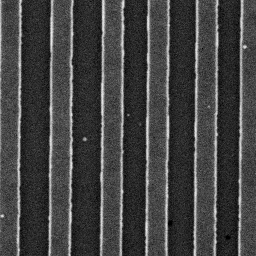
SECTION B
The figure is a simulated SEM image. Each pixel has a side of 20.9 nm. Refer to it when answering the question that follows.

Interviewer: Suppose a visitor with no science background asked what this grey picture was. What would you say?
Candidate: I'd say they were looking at lines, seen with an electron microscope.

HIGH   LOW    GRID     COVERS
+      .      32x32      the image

+++....++....++....++....++...++
+++...+++....++....++....++...++
+++...+++....++....++....++...++
+++...+++....++....++....++...++
+++...+++....++....++....++...++
+++...+++....++....++....++...++
+++...+++....++....++....++...++
++....+++....++....++....++...++
+++...+++....++....++....++...++
+++...+++....++....++....++...++
++....+++....++....++....++...++
++....+++....++....++....++...++
++....+++....++....++....++...++
++....+++....++....++....++...++
++....+++....++...+++....++...++
++....+++....++...+++...+++...++
++....+++....++...+++...+++...++
++....+++....++...+++...+++...++
++....+++....++...+++...+++...++
++....+++....++...+++...+++...++
++....+++....++...+++...+++...++
++....+++....++...+++...+++...++
++....+++....++...+++...+++...++
++....+++....++...+++...+++...++
++....+++....++...+++...+++...++
++....+++....++...+++...+++...++
++....+++....++...+++...+++...++
++....+++....++...+++...+++...++
++....+++....++...+++...+++...++
++....+++....++...+++...+++...++
++....+++....++...+++...+++...++
++....+++....++...+++...+++...++